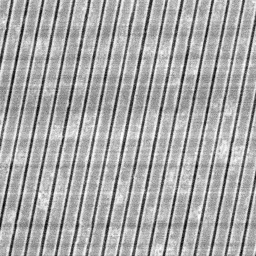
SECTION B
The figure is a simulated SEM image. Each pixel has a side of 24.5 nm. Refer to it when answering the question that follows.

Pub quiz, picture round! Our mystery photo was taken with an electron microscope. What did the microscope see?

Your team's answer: parallel lines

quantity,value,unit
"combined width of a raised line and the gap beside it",0.372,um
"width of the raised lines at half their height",0.277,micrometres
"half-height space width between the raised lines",0.105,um